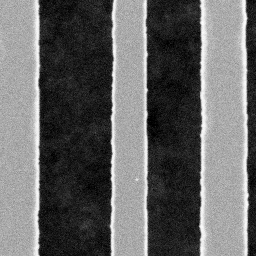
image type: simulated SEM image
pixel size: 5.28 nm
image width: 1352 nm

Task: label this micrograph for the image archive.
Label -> lines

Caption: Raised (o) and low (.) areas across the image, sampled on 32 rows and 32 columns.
ooooo.........oooo.......oooooo.
ooooo.........oooo.......oooooo.
ooooo.........oooo.......oooooo.
ooooo.........oooo.......oooooo.
ooooo.........oooo.......oooooo.
ooooo.........oooo.......oooooo.
ooooo.........oooo.......oooooo.
ooooo.........oooo.......oooooo.
ooooo.........oooo.......oooooo.
ooooo.........oooo.......oooooo.
ooooo.........oooo.......oooooo.
ooooo.........oooo.......oooooo.
ooooo.........oooo.......oooooo.
ooooo.........oooo.......oooooo.
ooooo.........oooo.......oooooo.
ooooo.........oooo.......oooooo.
ooooo.........oooo.......oooooo.
ooooo.........oooo.......oooooo.
ooooo.........oooo.......oooooo.
ooooo.........oooo.......oooooo.
ooooo.........oooo.......oooooo.
ooooo.........oooo.......oooooo.
ooooo.........oooo.......oooooo.
ooooo.........oooo.......oooooo.
ooooo.........oooo.......oooooo.
ooooo.........oooo.......oooooo.
ooooo.........oooo.......oooooo.
ooooo.........oooo.......oooooo.
ooooo.........oooo.......oooooo.
ooooo.........oooo.......oooooo.
ooooo.........oooo.......oooooo.
ooooo.........oooo.......oooooo.